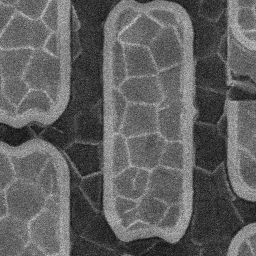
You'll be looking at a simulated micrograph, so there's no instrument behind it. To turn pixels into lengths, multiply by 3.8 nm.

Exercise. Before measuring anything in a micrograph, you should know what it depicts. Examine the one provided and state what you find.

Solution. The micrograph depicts one or a few lines or trenches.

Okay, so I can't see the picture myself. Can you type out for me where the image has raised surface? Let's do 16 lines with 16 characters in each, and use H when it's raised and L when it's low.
HHHHLLLLHHHLLLLH
HHHHLLLHHHHHLLLH
HHHHLLLHHHHHLLLH
HHHHLLLHHHHHLLLL
HHHHLLLHHHHHLLLL
HHHHLLLHHHHHLLLL
HHHHLLLHHHHHLLLH
LHLLLLLHHHHHLLLH
LLLLLLLHHHHHLLLH
HHHLLLLHHHHHLLLH
HHHHLLLHHHHHLLLH
HHHHLLLHHHHHLLLH
HHHHLLLHHHHHLLLL
HHHHLLLHHHHHLLLL
HHHHLLLLHHHLLLLH
HHHHLLLLLLLLLLLH